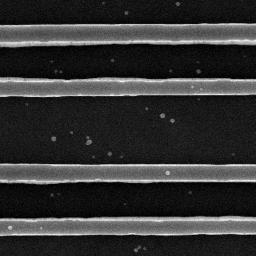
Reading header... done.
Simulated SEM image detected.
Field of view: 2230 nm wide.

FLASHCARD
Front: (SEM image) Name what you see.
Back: lines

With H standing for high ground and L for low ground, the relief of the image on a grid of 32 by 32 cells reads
LLLLLLLLLLLLLLLLLLLLLLLLLLLLLLLL
LLLLLLLLLLLLLLLLLLLLLLLLLLLLLLLL
LLLLLLLLLLLLLLLLLLLLLLLLLLLLLLLL
HHHHHHHHHHHHHHHHHHHHHHHHHHHHHHHH
HHHHHHHHHHHHHHHHHHHHHHHHHHHHHHHH
LLLLLLLLLLLLLLLLLLLLLLLLLLLLLLLL
LLLLLLLLLLLLLLLLLLLLLLLLLLLLLLLL
LLLLLLLLLLLLLLLLLLLLLLLLLLLLLLLL
LLLLLLLLLLLLLLLLLLLLLLLLLLLLLLLL
LLLLLLLLLLLLLLLLLLLLLLLLLLLLLLLL
HHHHHHHHHHHHHHHHHHHHHHHHHHHHHHHH
HHHHHHHHHHHHHHHHHHHHHHHHHHHHHHHH
LLLLLLLLLLLLLLLLLLLLLLLLLLLLLLLL
LLLLLLLLLLLLLLLLLLLLLLLLLLLLLLLL
LLLLLLLLLLLLLLLLLLLLLLLLLLLLLLLL
LLLLLLLLLLLLLLLLLLLLLLLLLLLLLLLL
LLLLLLLLLLLLLLLLLLLLLLLLLLLLLLLL
LLLLLLLLLLLLLLLLLLLLLLLLLLLLLLLL
LLLLLLLLLLLLLLLLLLLLLLLLLLLLLLLL
LLLLLLLLLLLLLLLLLLLLLLLLLLLLLLLL
LLLLLLLLLLLLLLLLLLLLLLLLLLLLLLLL
HHHHHHHHHHHHHHHHHHHHHHHHHHHHHHHH
HHHHHHHHHHHHLHHHHHHHHHHHHHHHHHHH
LLLLLLLLLLLLLLLLLLLLLLLLLLLLLLLL
LLLLLLLLLLLLLLLLLLLLLLLLLLLLLLLL
LLLLLLLLLLLLLLLLLLLLLLLLLLLLLLLL
LLLLLLLLLLLLLLLLLLLLLLLLLLLLLLLL
HHHLHHHHHHHHHHHHHHHHHHHHHHHHHHHH
HHHHHHHHHHHHHHHHHHHHHHHHHHHHHHHH
LLLLLLLLLLLLLLLLLLLLLLLLLLLLLLLL
LLLLLLLLLLLLLLLLLLLLLLLLLLLLLLLL
LLLLLLLLLLLLLLLLLLLLLLLLLLLLLLLL